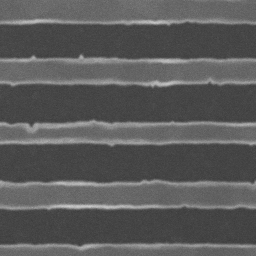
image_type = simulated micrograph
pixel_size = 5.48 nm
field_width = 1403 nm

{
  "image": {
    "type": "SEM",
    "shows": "parallel lines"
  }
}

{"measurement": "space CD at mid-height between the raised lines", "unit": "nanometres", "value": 208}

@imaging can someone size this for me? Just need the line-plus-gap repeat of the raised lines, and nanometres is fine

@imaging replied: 334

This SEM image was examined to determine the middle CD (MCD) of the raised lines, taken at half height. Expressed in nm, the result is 128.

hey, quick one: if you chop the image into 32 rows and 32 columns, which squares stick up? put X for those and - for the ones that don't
XXXXXXX--XXXXX-XXXXXXXXXXXXXXXXX
XXX----XXXXXXXXX----XXXXXXXXXXXX
XXX---XXXXXXXXXXX---XXXXXXXXXXXX
--------------------------------
--------------------------------
--------------------------------
--------------------------------
XXXXXXXXXXXXXXXX-XX---XXXXX-XXXX
XXXXXXXXXXXXXXXXXXX---XXXXXXXXXX
XXXXXXXXXXXXXXXXXXX---XXXXXXXXXX
-X---------------XX-------------
--------------------------------
--------------------------------
--------------------------------
--------------------------------
X-X----XXXXXXXXXXXXXXXXXXXXXXXXX
XXXXXXXXXXXXXXXXXXXXXXXXXXXXXXXX
XXXXXXXXXXXXXXXXXXXXXXXXXXXXXXXX
--------------------------------
--------------------------------
--------------------------------
--------------------------------
--------------------------------
XXXXXXX----XXXXXXXXXXXXXXXXXXXXX
XXXXXXX------XXXXXXXXXXXXXXXXXXX
XXXXXXX----------XXXXXXXXXXXXXXX
--------------------------------
--------------------------------
--------------------------------
--------------------------------
--------------------------------
XXXXXXXXXXXXXXXXXXXXXXXXXXXXXXXX